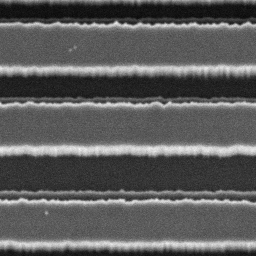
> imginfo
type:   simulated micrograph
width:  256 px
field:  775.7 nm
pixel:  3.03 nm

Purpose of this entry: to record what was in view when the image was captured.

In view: lines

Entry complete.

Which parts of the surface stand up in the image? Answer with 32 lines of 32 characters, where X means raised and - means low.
--------------------------------
--------------------------------
--------------------------------
XXXXXXXXXXXXXXXXXXXXXXXXXXXXXXXX
XXXXXXXXXXXXXXXXXXXXXXXXXXXXXXXX
XXXXXXXXXXXXXXXXXXXXXXXXXXXXXXXX
XXXXXXXXXXXXXXXXXXXXXXXXXXXXXXXX
XXXXXXXXXXXXXXXXXXXXXXXXXXXXXXXX
XXXXXXXXXXXXXXXXXXXXXXXXXXXXXXXX
--------------------------------
--------------------------------
--------------------------------
--------------------------------
XXXXXXXXXXXXXXXXXXXXXXXXXXXXXXXX
XXXXXXXXXXXXXXXXXXXXXXXXXXXXXXXX
XXXXXXXXXXXXXXXXXXXXXXXXXXXXXXXX
XXXXXXXXXXXXXXXXXXXXXXXXXXXXXXXX
XXXXXXXXXXXXXXXXXXXXXXXXXXXXXXXX
XXXXXXXXXXXXXXXXXXXXXXXXXXXXXXXX
--------------------------------
--------------------------------
--------------------------------
--------------------------------
--------------------------------
--------------------------------
XXXXXXXXXXXXXXXXXXXXXXXXXXXXXXXX
XXXXXXXXXXXXXXXXXXXXXXXXXXXXXXXX
XXXXXXXXXXXXXXXXXXXXXXXXXXXXXXXX
XXXXXXXXXXXXXXXXXXXXXXXXXXXXXXXX
XXXXXXXXXXXXXXXXXXXXXXXXXXXXXXXX
XXXXXXXXXXXXXXXXXXXXXXXXXXXXXXXX
--------------------------------